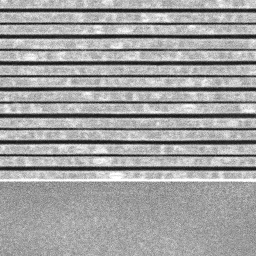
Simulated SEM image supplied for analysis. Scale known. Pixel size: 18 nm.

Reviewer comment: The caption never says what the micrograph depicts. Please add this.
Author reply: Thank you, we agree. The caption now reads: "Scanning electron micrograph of parallel lines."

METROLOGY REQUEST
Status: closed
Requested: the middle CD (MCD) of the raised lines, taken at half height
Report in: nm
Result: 178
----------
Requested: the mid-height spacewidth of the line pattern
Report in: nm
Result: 78.9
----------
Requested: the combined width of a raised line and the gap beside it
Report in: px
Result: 13.1